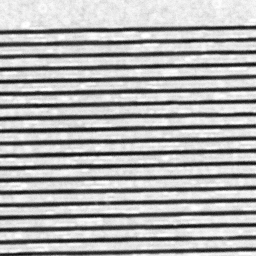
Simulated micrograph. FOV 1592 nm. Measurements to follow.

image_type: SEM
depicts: parallel lines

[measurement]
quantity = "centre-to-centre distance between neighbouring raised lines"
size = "76.8 nm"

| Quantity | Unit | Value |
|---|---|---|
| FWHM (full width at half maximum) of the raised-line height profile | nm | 49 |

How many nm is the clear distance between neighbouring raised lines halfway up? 27.2